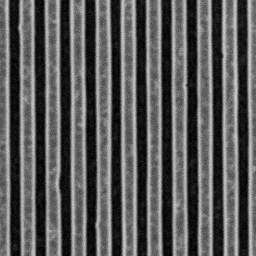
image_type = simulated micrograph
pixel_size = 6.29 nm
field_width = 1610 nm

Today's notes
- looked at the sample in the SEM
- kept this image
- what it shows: parallel lines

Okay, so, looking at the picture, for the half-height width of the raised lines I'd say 80.2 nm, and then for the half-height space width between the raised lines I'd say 79.4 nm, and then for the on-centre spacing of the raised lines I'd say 160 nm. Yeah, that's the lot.